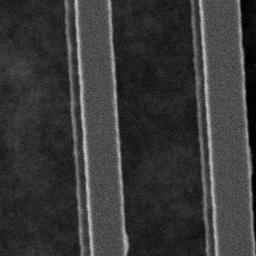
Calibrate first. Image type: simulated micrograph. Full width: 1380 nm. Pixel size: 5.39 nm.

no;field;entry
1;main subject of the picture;lines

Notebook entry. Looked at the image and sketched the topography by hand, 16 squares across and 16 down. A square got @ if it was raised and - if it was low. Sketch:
----@@@-----@@@-
----@@@-----@@@-
----@@@-----@@@-
----@@@-----@@@-
----@@@-----@@@-
----@@@-----@@@-
-----@@-----@@@-
-----@@-----@@@-
-----@@------@@-
-----@@------@@@
-----@@@-----@@@
-----@@@-----@@@
-----@@@-----@@@
-----@@@-----@@@
-----@@@-----@@@
-----@@@-----@@@